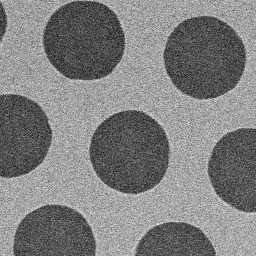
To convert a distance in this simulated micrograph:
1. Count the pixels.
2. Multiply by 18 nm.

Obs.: holes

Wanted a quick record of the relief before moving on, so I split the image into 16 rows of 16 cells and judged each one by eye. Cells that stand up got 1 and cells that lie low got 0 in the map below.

1111000111111111
1110000011100011
1110000011000001
1110000011000001
1111000111000001
1111111111100001
0011111111111111
0001111000111111
0001110000111100
0001110000011000
0011110000111000
1111111000111000
1111111111111100
1100011111111111
1000001110000111
1000001110000111